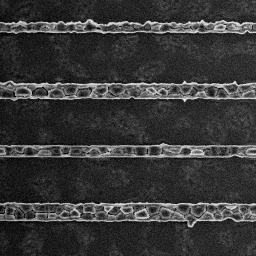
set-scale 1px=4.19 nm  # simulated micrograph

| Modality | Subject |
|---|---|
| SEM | one or a few lines or trenches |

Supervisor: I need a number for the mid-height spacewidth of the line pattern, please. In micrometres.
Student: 0.195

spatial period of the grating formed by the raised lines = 0.258 micrometres